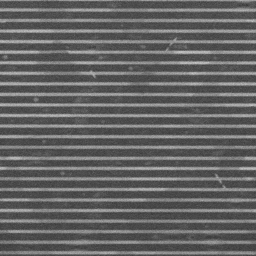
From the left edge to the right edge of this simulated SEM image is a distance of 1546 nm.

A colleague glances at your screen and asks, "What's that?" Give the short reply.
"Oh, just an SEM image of parallel lines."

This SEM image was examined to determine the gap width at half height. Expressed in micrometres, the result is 0.0514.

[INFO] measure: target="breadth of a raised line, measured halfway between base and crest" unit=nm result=14.4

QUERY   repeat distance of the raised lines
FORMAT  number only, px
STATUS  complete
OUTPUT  10.6